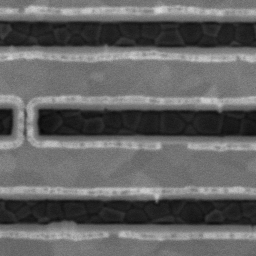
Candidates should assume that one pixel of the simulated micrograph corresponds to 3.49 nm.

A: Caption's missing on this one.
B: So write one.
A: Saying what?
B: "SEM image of one or a few lines or trenches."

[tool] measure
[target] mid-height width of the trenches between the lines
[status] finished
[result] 115 nanometers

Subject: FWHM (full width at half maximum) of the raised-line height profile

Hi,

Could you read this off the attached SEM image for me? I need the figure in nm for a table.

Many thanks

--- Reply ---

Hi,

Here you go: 196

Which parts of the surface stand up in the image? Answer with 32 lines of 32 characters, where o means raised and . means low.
oooooooooooooooooooooooooooooooo
oooooooooooooooooooooooooooooooo
................................
................................
................................
................................
.oooooooooooooooooooooo.........
oooooooooooooooooooooooooooooooo
oooooooooooooooooooooooooooooooo
oooooooooooooooooooooooooooooooo
oooooooooooooooooooooooooooooooo
oooooooooooooooooooooooooooooooo
oooooooooooooooooooooooooooooooo
..oo............................
..oo............................
..oo............................
..oo............................
.oooo...........................
oooooooooooooooooooooooooooooooo
oooooooooooooooooooooooooooooooo
oooooooooooooooooooooooooooooooo
oooooooooooooooooooooooooooooooo
oooooooooooooooooooooooooooooooo
oooooooooooooooooooooooooooooooo
...................o............
................................
................................
................................
.......oo.......................
oooooooooooooooooooooooooooooooo
oooooooooooooooooooooooooooooooo
oooooooooooooooooooooooooooooooo